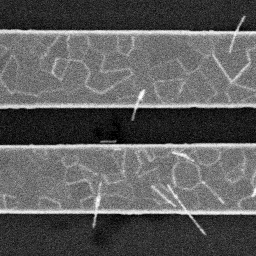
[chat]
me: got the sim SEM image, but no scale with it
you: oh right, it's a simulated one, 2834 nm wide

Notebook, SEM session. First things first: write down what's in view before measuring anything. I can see lines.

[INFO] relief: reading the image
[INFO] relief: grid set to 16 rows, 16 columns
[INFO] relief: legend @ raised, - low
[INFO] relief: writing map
----------------
----------------
@@@@@@@@@@@@@@@@
@@@@@@@@@@@@@@@@
@@@@@@@@@@@@@@@@
@@@@@@@@@@@@@@@@
@@@@@@@@@@@@@@@@
----------------
----------------
@@@@@@@@@@@@@@@@
@@@@@@@@@@@@@@@@
@@@@@@@@@@@@@@@@
@@@@@@@@@@@@@@@@
----------------
----------------
----------------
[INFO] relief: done